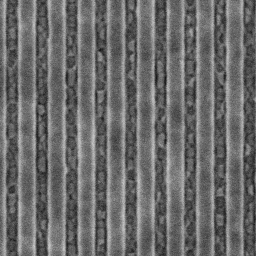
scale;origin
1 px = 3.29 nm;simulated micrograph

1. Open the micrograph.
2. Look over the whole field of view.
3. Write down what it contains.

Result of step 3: parallel lines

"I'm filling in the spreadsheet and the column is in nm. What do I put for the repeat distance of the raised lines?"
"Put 97.6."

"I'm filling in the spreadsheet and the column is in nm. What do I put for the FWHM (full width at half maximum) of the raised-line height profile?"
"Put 56.7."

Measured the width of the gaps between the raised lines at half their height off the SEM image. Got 39.8 nanometers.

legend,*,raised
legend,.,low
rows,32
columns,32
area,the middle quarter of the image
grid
....****...****...*****...****..
....****...****...*****...****..
....****...****...*****...****..
....****...****...*****...****..
....****...****...*****...****..
*...****...****...*****...****..
....****...****...*****...****..
*...****...****...*****...****..
*...****...****...*****...****..
....****...****...*****...****..
...*****...****...*****...****..
...*****...****...*****...****..
...*****...****....****...****..
....***....****...*****...****..
....****...****...*****...****..
....****...****...****....****..
....****...****...*****...****..
....****...****...*****...****..
....***....****...*****...****..
....***....****...*****...****..
....***....****...*****...****..
....***....****...*****...****..
....****...****....***....****..
....****...****...****....****..
....****...****...*****...****..
*...****...****...*****...****..
*...****...****...*****...****..
*...****...****....****...****..
....****...****....****...****..
....****...****....****...****..
....****...****....***....****..
....****...****...****....****..